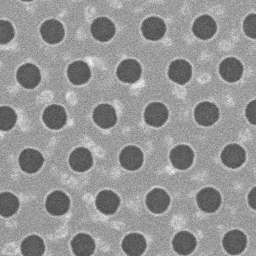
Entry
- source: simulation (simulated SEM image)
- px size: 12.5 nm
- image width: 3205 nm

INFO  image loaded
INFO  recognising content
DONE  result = a regular array of holes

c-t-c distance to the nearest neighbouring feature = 0.621 um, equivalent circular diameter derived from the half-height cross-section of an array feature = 333 nm